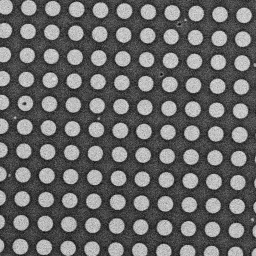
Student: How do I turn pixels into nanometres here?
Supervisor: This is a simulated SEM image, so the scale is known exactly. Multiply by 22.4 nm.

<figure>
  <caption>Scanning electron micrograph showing an array of small figures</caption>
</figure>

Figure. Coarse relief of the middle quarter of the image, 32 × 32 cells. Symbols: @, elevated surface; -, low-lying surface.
--------------------@@---@@@---@
--------------------------------
--------------------------------
-@@@---@@@---@@@---@@@---@@-----
-@@@---@@@---@@@---@@@---@@@---@
-@@@---@@@---@@@---@@@---@@@---@
-------------------@@@---@@@---@
--------------------------------
--@-----------------------------
-@@@---@@@---@@@---@@@---@@-----
-@@@---@@@--@@@@--@@@@---@@@---@
-@@@---@@@---@@@---@@@--@@@@--@@
-------------------@@----@@----@
--------------------------------
-@@-----------------------------
@@@@--@@@@---@@@---@@----@@-----
@@@@--@@@@--@@@@--@@@@--@@@@--@@
-@@----@@@--@@@@--@@@@--@@@@--@@
-------------------@@----@@----@
--------------------------------
-@@-----------------------------
@@@@--@@@---@@@---@@@----@@-----
@@@@--@@@@--@@@@--@@@@--@@@@--@@
-@@---@@@---@@@---@@@@--@@@@--@@
-------------------@-----@@---@@
--------------------------------
-@------------------------------
@@@---@@@---@@@---@@@---@@@----@
@@@---@@@---@@@---@@@---@@@---@@
@@@---@@@---@@@---@@@---@@@---@@
------------------------@@@---@@
--------------------------------